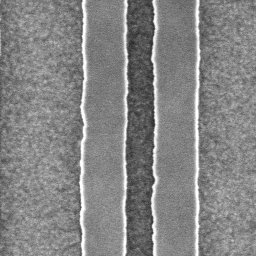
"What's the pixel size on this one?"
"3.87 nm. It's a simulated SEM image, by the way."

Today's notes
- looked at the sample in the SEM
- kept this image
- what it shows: lines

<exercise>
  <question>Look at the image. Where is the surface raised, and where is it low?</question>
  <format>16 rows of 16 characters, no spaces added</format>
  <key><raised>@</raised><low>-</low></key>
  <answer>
-----@@@--@@----
-----@@@--@@----
-----@@@--@@----
-----@@@-@@@----
-----@@@--@@----
-----@@@--@@----
-----@@@--@@----
-----@@@--@@----
-----@@@--@@----
-----@@@--@@----
-----@@@--@@----
-----@@@--@@----
-----@@@-@@@----
-----@@@--@@----
-----@@@--@@----
-----@@@--@@----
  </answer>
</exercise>